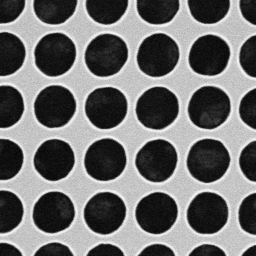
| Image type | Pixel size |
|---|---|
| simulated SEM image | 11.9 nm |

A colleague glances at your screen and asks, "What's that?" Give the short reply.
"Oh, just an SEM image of a regular array of holes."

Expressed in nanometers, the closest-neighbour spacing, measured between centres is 612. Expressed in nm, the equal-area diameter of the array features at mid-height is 513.